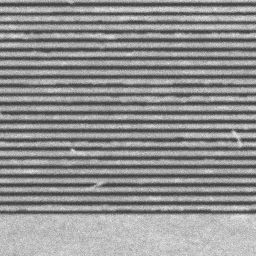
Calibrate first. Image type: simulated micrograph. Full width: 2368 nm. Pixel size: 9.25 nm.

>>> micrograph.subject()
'parallel lines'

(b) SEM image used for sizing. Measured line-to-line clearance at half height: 39.3 nanometers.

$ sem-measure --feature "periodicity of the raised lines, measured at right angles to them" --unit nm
83.2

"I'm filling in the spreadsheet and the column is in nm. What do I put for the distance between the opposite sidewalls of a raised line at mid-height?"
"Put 47.4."